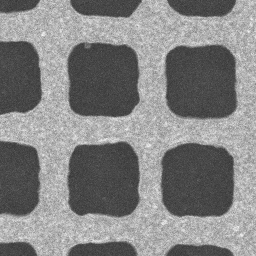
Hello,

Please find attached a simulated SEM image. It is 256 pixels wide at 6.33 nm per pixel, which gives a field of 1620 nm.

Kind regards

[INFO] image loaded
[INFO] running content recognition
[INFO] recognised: holes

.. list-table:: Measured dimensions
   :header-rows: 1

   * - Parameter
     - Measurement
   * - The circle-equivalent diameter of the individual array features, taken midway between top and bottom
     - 0.5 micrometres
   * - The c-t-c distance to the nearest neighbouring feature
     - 607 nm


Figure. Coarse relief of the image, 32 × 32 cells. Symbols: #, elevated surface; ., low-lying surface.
.....####.........###........###
...#######.......#####.......###
################################
################################
################################
....######....##################
.....####........####........###
.....###.........####........###
.....###.........####........###
.....###.........####........###
.....####........####........###
.....####........####........###
.....####........####.........##
....#####........####.........##
##########.....#######.......###
################################
################################
################################
....#####........#####......####
.....####........###.........###
.....####........###.........###
.....###..........##.........###
.....###.........###.........###
.....###.........###.........###
.....####........###.........###
.....####........###.........###
....#####........####.......####
################################
################################
################################
....######......######.#########
.....####........####........###